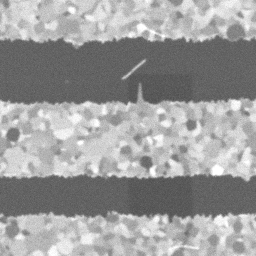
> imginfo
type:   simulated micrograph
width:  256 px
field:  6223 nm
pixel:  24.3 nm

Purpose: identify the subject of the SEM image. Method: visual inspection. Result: one or a few lines or trenches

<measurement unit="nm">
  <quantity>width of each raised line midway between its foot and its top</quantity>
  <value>1750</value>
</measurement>